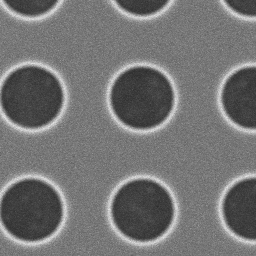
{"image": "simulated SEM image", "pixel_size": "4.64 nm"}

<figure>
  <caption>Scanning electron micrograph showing holes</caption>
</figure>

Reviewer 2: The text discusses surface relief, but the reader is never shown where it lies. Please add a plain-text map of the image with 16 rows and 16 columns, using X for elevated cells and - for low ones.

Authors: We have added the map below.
X--XXXXX--XXXX--
XXXXXXXXXXXXXXXX
XXXXXXXXXXXXXXXX
XXXXXXXXXXXXXXXX
X--XXXXX--XXXXX-
----XXX----XXX--
----XXX----XXX--
X--XXXX---XXXX--
XXXXXXXXXXXXXXXX
XXXXXXXXXXXXXXXX
XXXXXXXXXXXXXXXX
X--XXXXX--XXXXX-
----XXX----XXX--
----XXX----XXX--
X--XXXXX--XXXXX-
XXXXXXXXXXXXXXXX